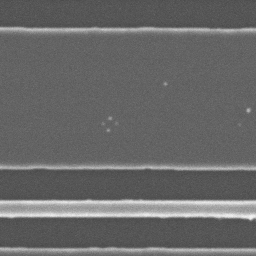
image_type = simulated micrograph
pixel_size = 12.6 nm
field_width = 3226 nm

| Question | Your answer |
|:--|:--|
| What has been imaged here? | lines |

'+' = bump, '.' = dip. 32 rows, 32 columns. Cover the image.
................................
................................
................................
................................
++++++++++++++++++++++++++++++++
++++++++++++++++++++++++++++++++
++++++++++++++++++++++++++++++++
++++++++++++++++++++++++++++++++
++++++++++++++++++++++++++++++++
++++++++++++++++++++++++++++++++
++++++++++++++++++++++++++++++++
++++++++++++++++++++++++++++++++
++++++++++++++++++++++++++++++++
++++++++++++++++++++++++++++++++
++++++++++++++++++++++++++++++++
++++++++++++++++++++++++++++++++
++++++++++++++++++++++++++++++++
++++++++++++++++++++++++++++++++
++++++++++++++++++++++++++++++++
++++++++++++++++++++++++++++++++
++++++++++++++++++++++++++++++++
................................
................................
................................
................................
++++++++++++++++++++++++++++++++
++++++++++++++++++++++++++++++++
................................
................................
................................
................................
++++++++++++++++++++++++++++++++